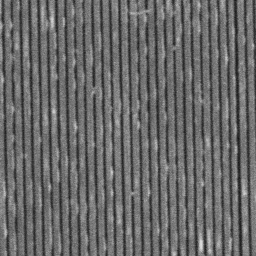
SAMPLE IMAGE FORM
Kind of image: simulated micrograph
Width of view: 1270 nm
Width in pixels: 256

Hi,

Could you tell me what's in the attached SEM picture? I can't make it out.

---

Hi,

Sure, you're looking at parallel lines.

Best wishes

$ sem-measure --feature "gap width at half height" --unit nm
13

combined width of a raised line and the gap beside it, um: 0.0445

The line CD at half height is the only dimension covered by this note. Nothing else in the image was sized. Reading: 30.4 nm